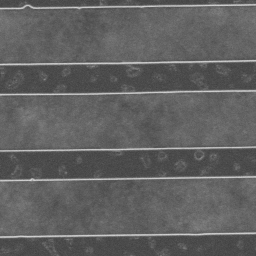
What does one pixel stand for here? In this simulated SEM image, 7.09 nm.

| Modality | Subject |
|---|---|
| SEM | one or a few lines or trenches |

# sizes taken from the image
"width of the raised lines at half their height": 217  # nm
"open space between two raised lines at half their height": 0.395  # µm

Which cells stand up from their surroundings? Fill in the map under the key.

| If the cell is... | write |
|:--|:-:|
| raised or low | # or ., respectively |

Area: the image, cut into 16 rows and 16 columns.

#...#...........
................
................
................
################
################
................
................
................
################
################
................
................
................
................
################